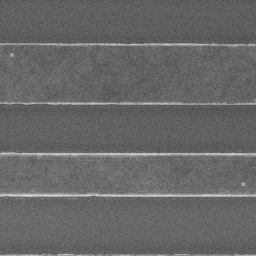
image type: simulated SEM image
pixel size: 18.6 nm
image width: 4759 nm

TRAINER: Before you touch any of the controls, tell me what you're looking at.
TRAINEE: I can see lines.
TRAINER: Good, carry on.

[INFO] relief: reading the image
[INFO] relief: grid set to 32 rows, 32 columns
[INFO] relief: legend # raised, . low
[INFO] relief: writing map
................................
................................
................................
................................
................................
................................
################################
################################
################################
################################
################################
################################
################################
................................
................................
................................
................................
................................
................................
################################
################################
################################
################################
################################
................................
................................
................................
................................
................................
................................
................................
................................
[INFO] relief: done